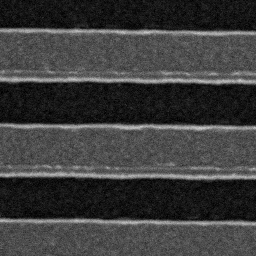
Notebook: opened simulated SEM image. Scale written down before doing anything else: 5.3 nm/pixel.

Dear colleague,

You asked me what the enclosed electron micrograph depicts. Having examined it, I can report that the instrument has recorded lines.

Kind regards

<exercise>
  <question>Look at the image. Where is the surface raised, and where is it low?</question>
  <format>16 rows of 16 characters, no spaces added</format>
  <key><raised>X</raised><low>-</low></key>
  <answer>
----------------
----------------
XXXXXXXXXXXXXXXX
XXXXXXXXXXXXXXXX
XXXXXXXXXXXXXXXX
----------------
----------------
----------------
XXXXXXXXXXXXXXXX
XXXXXXXXXXXXXXXX
XXXXXXXXXXXXXXXX
----------------
----------------
----------------
XXXXXXXXXXXXXXXX
XXXXXXXXXXXXXXXX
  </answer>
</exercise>